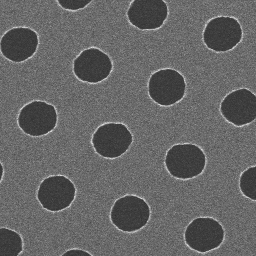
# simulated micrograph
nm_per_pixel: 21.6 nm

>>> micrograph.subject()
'a regular array of holes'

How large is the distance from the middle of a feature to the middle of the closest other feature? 1.65 micrometres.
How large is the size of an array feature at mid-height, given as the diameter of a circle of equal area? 0.787 microns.